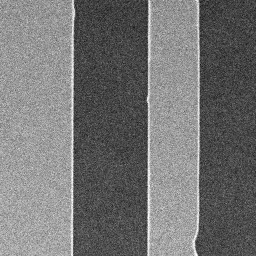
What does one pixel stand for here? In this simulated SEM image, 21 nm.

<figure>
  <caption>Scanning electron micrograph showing one or a few lines or trenches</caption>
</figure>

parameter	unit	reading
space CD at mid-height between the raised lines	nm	1600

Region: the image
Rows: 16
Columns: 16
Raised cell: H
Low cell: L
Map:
HHHHHLLLLHHHLLLL
HHHHHLLLLHHHLLLL
HHHHHLLLLHHHLLLL
HHHHHLLLLHHHLLLL
HHHHHLLLLHHHLLLL
HHHHHLLLLHHHLLLL
HHHHHLLLLHHHLLLL
HHHHHLLLLHHHLLLL
HHHHHLLLLHHHLLLL
HHHHHLLLLHHHLLLL
HHHHLLLLLHHHLLLL
HHHHLLLLLHHHLLLL
HHHHLLLLLHHHLLLL
HHHHLLLLLHHHLLLL
HHHHLLLLLHHHLLLL
HHHHLLLLLHHHLLLL